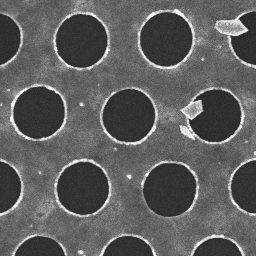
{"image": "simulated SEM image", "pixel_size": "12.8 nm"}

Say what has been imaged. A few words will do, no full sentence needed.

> holes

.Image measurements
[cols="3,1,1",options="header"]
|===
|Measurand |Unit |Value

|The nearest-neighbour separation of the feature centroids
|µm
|1.08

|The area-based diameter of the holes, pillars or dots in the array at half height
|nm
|680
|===